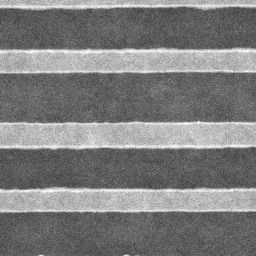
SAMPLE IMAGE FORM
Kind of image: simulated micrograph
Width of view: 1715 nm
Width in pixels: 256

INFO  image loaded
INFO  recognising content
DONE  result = lines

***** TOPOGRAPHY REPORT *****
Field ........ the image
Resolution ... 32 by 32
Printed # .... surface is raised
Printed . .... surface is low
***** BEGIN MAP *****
################################
................................
................................
................................
................................
................................
################################
################################
################################
................................
................................
................................
................................
................................
................................
################################
################################
################################
...##...........................
................................
................................
................................
................................
................................
################################
################################
................................
................................
................................
................................
................................
................................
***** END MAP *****